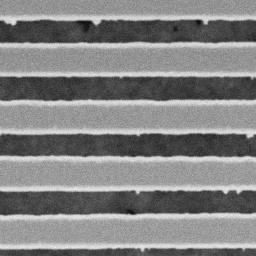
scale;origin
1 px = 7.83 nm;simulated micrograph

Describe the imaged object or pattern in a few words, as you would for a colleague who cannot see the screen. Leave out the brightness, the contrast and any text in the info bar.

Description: lines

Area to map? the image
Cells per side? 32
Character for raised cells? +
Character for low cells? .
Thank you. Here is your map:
++++++++++++++++++++++++++++++++
++++++++++++++++++++++++++++++++
................................
................................
................................
...+...++++++...+++..+++++++++++
++++++++++++++++++++++++++++++++
++++++++++++++++++++++++++++++++
++++++++++++++++++++++++++++++++
................................
................................
................................
................................
++++++++++++++++++++++++++++++++
++++++++++++++++++++++++++++++++
++++++++++++++++++++++++++++++++
+++++++++++++++++++.++++++++++++
................................
................................
................................
++++++++++++++++++++++++++++++++
++++++++++++++++++++++++++++++++
++++++++++++++++++++++++++++++++
++++++++++++++++++++++++++++++++
................................
................................
................................
++++++++++++++++++++++++++++++++
++++++++++++++++++++++++++++++++
++++++++++++++++++++++++++++++++
++++++++++++++++++++++++++++++++
................................